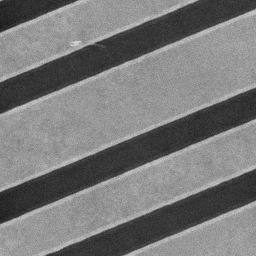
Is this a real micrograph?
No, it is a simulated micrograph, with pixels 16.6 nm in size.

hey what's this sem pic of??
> lines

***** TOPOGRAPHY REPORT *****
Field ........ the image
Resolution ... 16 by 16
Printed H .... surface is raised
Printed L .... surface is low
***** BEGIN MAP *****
LLLLHHHHHHHLLLLL
LHHHHHHHHLLLLLHH
HHHHHHLLLLLHHHHH
HHHHLLLLLHHHHHHH
HHLLLLHHHHHHHHHH
LLLLHHHHHHHHHHHH
LLHHHHHHHHHHHLLL
HHHHHHHHHHHLLLLL
HHHHHHHHLLLLLHHH
HHHHHHLLLLLHHHHH
HHHHLLLLLHHHHHHH
HLLLLLHHHHHHHHLL
LLLLHHHHHHHLLLLL
LHHHHHHHHLLLLLHH
HHHHHHLLLLLHHHHH
HHHHLLLLLHHHHHHH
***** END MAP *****